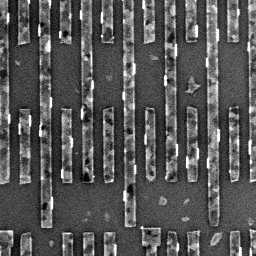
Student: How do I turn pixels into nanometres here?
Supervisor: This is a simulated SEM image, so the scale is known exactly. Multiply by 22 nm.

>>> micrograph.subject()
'wiring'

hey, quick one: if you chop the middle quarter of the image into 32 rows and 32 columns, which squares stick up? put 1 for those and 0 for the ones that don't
00000110000000011000000000110000
00000110000000011000000000110000
00000110000000011000000000110000
00000110000000011000000000110000
00000110000000011000000000110001
00000110000000011000000000110001
00000110000000011000000000110001
00000110000000011000000000110000
00000110000000011000000000110000
00000110000000011000000000110000
00000110000000011000000000110000
00000110001100011000010000110001
10000110001100011000011000110001
10000110001100011000011000110001
10000110001100011000011000110001
10000110001100011000011000110001
10000110001100011000011000110001
10000110001100011000011000110001
10000110001100011000011000110001
10000110001100011100011000110001
11000110001100011100011000110001
11000110001100011100011000110001
11000110001100011100011000110001
11000110001100011100011000110001
11000110001100011100011000110001
11000110001100011100011000110001
11000110001100011100011000110001
11000110001100011100011000110001
11000110001100011000011000110001
00000000000000011000000000000000
00000000000000011000000000000000
00000000000000001100000000000000